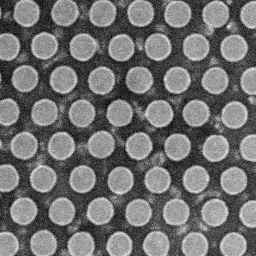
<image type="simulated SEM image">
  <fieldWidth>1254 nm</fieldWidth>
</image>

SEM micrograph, a regular array of raised bodies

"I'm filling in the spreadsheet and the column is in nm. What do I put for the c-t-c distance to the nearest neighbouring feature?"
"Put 182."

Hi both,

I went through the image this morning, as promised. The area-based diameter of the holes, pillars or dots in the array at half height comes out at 127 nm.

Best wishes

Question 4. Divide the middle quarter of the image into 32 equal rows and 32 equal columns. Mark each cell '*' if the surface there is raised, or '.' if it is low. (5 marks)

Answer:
................................
**......***......****.....****..
***....*****....******...******.
***...******....******...******.
***...*******...******...******.
**.....*****....******...******.
**.....*****.....****.....****..
................................
................................
...***......***........**.......
..*****.....****.....*****....**
.*******...******....******...**
.******....******....******...**
..*****....******....******...**
..*****.....****.....*****.....*
...***.................**.......
................................
*.......****......**............
**.....*****....*****.....*****.
**....******....******....*****.
***...******....******...******.
**....******....******...******.
**.....*****....*****.....*****.
.................***.......***..
................................
....*...........................
..*****.....****......***......*
..******....*****....*****....**
..******...******...******....**
..******...******...******....**
..*****....******....*****....**
...***......****.....****......*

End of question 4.